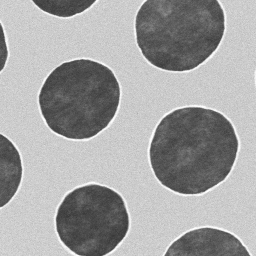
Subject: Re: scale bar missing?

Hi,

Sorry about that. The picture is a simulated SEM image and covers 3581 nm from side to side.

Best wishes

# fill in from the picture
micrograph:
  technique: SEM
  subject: holes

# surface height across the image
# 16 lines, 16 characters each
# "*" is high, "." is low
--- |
**...****.....**
********......**
*********.....**
*********....***
***....*********
***....*********
**.....*********
***....***....**
****..****.....*
.********......*
.*********....**
.*********....**
.***....********
****....********
****....****..**
****...****....*